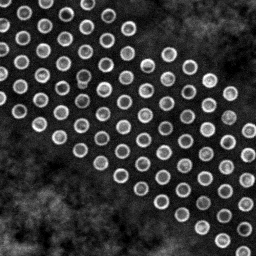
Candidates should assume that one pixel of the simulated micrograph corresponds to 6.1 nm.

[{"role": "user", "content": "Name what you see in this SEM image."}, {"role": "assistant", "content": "a regular array of raised bodies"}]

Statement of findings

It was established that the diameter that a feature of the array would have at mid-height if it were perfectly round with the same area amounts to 12.9 px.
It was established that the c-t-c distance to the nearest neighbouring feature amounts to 146 nm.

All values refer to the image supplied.